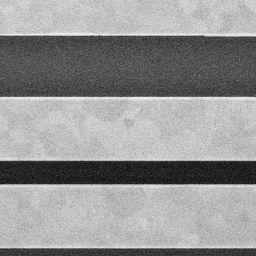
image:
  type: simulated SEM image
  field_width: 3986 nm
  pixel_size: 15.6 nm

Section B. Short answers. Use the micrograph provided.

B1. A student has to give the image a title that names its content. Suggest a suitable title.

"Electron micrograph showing lines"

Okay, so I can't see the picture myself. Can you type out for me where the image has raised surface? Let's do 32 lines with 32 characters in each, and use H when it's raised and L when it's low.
HHHHHHHHHHHHHHHHHHHHHHHHHHHHHHHH
HHHHHHHHHHHHHHHHHHHHHHHHHHHHHHHH
HHHHHHHHHHHHHHHHHHHHHHHHHHHHHHHH
HHHHHHHHHHHHHHHHHHHHHHHHHHHHHHHH
LLLLLLLLLLLLLLLLLLLLLLLLLLLLLLLL
LLLLLLLLLLLLLLLLLLLLLLLLLLLLLLLL
LLLLLLLLLLLLLLLLLLLLLLLLLLLLLLLL
LLLLLLLLLLLLLLLLLLLLLLLLLLLLLLLL
LLLLLLLLLLLLLLLLLLLLLLLLLLLLLLLL
LLLLLLLLLLLLLLLLLLLLLLLLLLLLLLLL
LLLLLLLLLLLLLLLLLLLLLLLLLLLLLLLL
LLLLLLLLLLLLLLLLLLLLLLLLLLLLLLLL
HHHHHHHHHHHHHHHHHHHHHHHHHHHHHHHH
HHHHHHHHHHHHHHHHHHHHHHHHHHHHHHHH
HHHHHHHHHHHHHHHHHHHHHHHHHHHHHHHH
HHHHHHHHHHHHHHHHHHHHHHHHHHHHHHHH
HHHHHHHHHHHHHHHHHHHHHHHHHHHHHHHH
HHHHHHHHHHHHHHHHHHHHHHHHHHHHHHHH
HHHHHHHHHHHHHHHHHHHHHHHHHHHHHHHH
HHHHHHHHHHHHHHHHHHHHHHHHHHHHHHHH
LLLLLLLLLLLLLLLLLLLLLLLLLLLLLLLL
LLLLLLLLLLLLLLLLLLLLLLLLLLLLLLLL
LLLLLLLLLLLLLLLLLLLLLLLLLLLLLLLL
HHHHHHHHHHHHHHHHHHHHHHHHHHHHHHHH
HHHHHHHHHHHHHHHHHHHHHHHHHHHHHHHH
HHHHHHHHHHHHHHHHHHHHHHHHHHHHHHHH
HHHHHHHHHHHHHHHHHHHHHHHHHHHHHHHH
HHHHHHHHHHHHHHHHHHHHHHHHHHHHHHHH
HHHHHHHHHHHHHHHHHHHHHHHHHHHHHHHH
HHHHHHHHHHHHHHHHHHHHHHHHHHHHHHHH
HHHHHHHHHHHHHHHHHHHHHHHHHHHHHHHH
LLLLLLLLLLLLLLLLLLLLLLLLLLLLLLLL